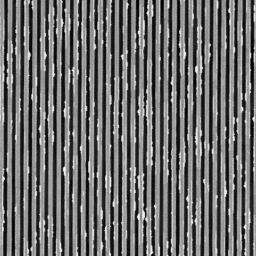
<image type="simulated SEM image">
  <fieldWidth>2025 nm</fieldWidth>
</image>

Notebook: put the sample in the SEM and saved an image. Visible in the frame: parallel lines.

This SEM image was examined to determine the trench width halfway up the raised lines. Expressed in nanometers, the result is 26.7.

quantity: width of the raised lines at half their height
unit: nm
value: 39.5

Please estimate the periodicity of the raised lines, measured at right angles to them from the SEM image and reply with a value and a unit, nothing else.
64.9 nm